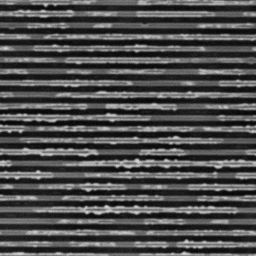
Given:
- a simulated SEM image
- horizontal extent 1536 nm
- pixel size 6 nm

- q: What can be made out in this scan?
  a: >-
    parallel lines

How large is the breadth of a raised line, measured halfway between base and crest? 27.7 nanometers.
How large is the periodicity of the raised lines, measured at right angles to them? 69.1 nm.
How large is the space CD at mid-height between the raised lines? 38.2 nm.